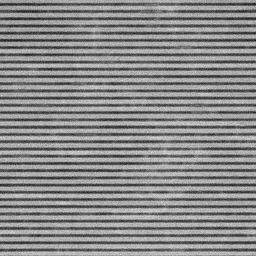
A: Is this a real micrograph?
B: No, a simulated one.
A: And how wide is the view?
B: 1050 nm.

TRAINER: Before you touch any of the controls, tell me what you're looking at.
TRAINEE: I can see parallel lines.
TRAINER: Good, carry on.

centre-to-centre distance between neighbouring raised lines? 29.6 nanometres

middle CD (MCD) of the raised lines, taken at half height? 14.4 nm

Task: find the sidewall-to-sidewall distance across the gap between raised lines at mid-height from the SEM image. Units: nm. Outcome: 14.4